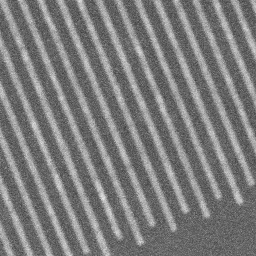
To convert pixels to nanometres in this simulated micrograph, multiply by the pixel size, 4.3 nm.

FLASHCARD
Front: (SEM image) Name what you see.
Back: parallel lines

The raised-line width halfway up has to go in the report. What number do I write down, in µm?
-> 0.0179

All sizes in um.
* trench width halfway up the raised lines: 0.0604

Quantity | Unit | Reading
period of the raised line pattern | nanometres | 76.8